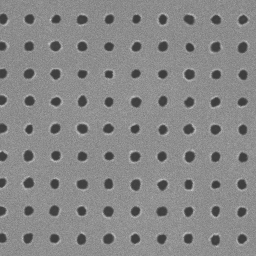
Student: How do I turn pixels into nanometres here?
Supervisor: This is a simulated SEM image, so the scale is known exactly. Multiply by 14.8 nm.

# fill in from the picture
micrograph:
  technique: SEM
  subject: a regular array of holes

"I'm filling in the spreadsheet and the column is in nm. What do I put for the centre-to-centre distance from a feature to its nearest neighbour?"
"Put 390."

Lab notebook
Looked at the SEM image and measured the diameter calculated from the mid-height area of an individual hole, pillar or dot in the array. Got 145 nm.